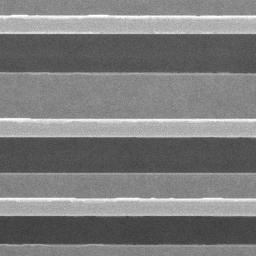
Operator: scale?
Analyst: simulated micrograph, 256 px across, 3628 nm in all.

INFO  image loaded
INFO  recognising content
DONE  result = lines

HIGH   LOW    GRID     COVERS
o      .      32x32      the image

oooooooooooooooooooooooooooooooo
oooooooooooooooooooooooooooooooo
oooooooooooooooooooooooooooooooo
oooooooooooooooooooooooooooooooo
................................
................................
................................
................................
................................
oooooooooooooooooooooooooooooooo
oooooooooooooooooooooooooooooooo
oooooooooooooooooooooooooooooooo
oooooooooooooooooooooooooooooooo
oooooooooooooooooooooooooooooooo
oooooooooooooooooooooooooooooooo
oooooooooooooooooooooooooooooooo
oooooooooooooooooooooooooooooooo
................................
................................
................................
................................
................................
oooooooooooooooooooooooooooooooo
oooooooooooooooooooooooooooooooo
oooooooooooooooooooooooooooooooo
oooooooooooooooooooooooooooooooo
oooooooooooooooooooooooooooooooo
................................
................................
................................
................................
oooooooooooooooooooooooooooooooo